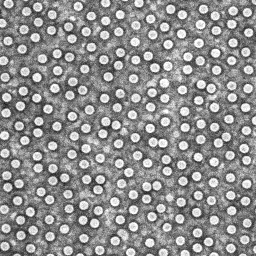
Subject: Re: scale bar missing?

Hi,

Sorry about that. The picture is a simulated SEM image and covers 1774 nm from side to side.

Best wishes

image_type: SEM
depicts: a regular array of raised bodies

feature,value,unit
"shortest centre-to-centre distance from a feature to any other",101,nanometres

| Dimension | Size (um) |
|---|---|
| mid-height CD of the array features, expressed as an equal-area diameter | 0.0585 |